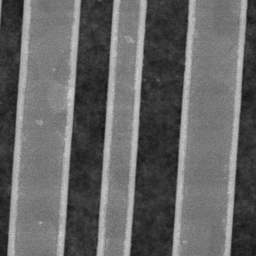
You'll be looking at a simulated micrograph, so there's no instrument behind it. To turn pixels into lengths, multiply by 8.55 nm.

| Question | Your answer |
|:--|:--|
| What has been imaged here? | one or a few lines or trenches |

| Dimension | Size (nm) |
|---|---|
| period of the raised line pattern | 707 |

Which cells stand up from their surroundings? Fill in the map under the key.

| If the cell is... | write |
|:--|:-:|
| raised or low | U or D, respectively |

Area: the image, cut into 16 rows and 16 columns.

DDUUUDDUUDDDUUUD
DDUUUDDUUDDDUUUD
DDUUUDDUUDDDUUUD
DUUUUDDUUDDDUUUD
DUUUUDDUUDDDUUUD
DUUUUDDUUDDDUUUD
DUUUDDDUUDDDUUUD
DUUUDDDUUDDDUUUD
DUUUDDDUDDDUUUUD
DUUUDDDUDDDUUUUD
DUUUDDDUDDDUUUUD
DUUUDDDUDDDUUUDD
DUUUDDUUDDDUUUDD
DUUUDDUUDDDUUUDD
DUUUDDUUDDDUUUDD
DUUUDDUUDDDUUUDD